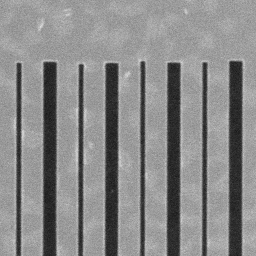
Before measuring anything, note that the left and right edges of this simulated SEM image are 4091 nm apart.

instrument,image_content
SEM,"parallel lines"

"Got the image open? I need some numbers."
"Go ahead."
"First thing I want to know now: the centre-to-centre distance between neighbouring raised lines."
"0.494 microns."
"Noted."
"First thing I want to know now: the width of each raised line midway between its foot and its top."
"336 nm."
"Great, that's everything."